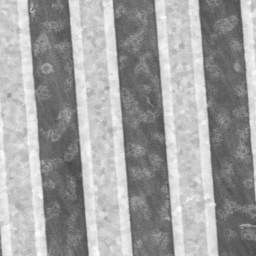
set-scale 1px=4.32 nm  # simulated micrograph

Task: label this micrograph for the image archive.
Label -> one or a few lines or trenches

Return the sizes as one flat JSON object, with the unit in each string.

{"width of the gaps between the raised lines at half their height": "0.223 um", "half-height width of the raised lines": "147 nm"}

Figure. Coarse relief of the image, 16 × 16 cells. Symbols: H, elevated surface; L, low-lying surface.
HLLLLHHLLLHHLLLH
HLLLLHHLLLHHLLLH
HHLLLHHLLLHHLLLL
HHLLLHHLLLHHLLLL
HHLLLHHLLLHHLLLL
HHLLLHHLLLHHHLLL
HHLLLHHLLLHHHLLL
HHLLLHHLLLLHHLLL
HHLLLHHLLLLHHLLL
HHLLLHHLLLLHHLLL
HHLLLHHHLLLHHLLL
HHLLLLHHLLLHHLLL
HHLLLLHHLLLHHLLL
HHLLLLHHLLLHHLLL
HHHLLLHHLLLHHLLL
HHHLLLHHLLLHHLLL